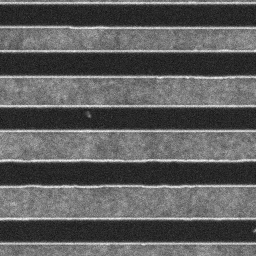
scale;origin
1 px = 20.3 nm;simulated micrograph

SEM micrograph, lines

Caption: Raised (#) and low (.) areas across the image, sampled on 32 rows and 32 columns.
################################
################################
################################
................................
................................
................................
################################
################################
################################
################################
................................
................................
................................
################################
################################
################################
................................
................................
................................
................................
################################
################################
################################
................................
................................
................................
................................
################################
################################
################################
.................##.............
................................